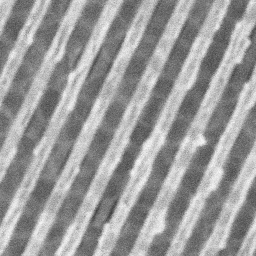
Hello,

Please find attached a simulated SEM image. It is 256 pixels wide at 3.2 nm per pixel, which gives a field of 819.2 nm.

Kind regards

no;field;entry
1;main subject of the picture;parallel lines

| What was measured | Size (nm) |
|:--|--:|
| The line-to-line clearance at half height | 58.4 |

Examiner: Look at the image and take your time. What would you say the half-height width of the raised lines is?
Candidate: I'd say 14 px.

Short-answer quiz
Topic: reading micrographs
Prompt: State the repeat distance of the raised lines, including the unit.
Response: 104 nanometres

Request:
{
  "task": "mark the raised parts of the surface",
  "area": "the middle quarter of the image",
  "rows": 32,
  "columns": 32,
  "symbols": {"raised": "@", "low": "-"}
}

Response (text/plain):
---@@@@-----@@@@-----@@@@-----@@
---@@@------@@@-----@@@@------@@
--@@@@-----@@@@-----@@@@-----@@@
-@@@@------@@@-----@@@@------@@@
-@@@@-----@@@@-----@@@@-----@@@@
-@@@------@@@-----@@@@------@@@@
@@@@-----@@@@-----@@@@-----@@@@-
@@@------@@@------@@@------@@@--
@@@-----@@@@-----@@@@-----@@@@--
@@@-----@@@------@@@@-----@@@---
@@-----@@@@-----@@@@-----@@@@---
@@-----@@@------@@@@-----@@@@---
@-----@@@@-----@@@@-----@@@@----
@-----@@@------@@@@-----@@@@----
-----@@@@-----@@@@-----@@@@-----
-----@@@@-----@@@@-----@@@@-----
-----@@@-----@@@@-----@@@@-----@
----@@@@-----@@@@-----@@@@-----@
----@@@-----@@@@-----@@@@-----@@
---@@@@-----@@@@----@@@@@-----@@
---@@@-----@@@@@----@@@@-----@@@
--@@@@-----@@@@-----@@@@-----@@@
--@@@-----@@@@@----@@@@-----@@@@
-@@@@-----@@@@----@@@@@-----@@@@
-@@@-----@@@@@----@@@@-----@@@@-
@@@@-----@@@@-----@@@@-----@@@@-
@@@@----@@@@-----@@@@@-----@@@--
@@@-----@@@@-----@@@@-----@@@@--
@@@----@@@@------@@@@-----@@@---
@@-----@@@@-----@@@@-----@@@@---
@@-----@@@@-----@@@@-----@@@----
@-----@@@@-----@@@@-----@@@@----